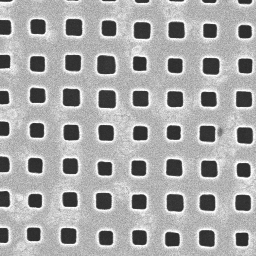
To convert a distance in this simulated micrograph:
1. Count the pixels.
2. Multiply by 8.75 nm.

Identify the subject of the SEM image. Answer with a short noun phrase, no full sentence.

a regular array of holes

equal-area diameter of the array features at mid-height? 147 nm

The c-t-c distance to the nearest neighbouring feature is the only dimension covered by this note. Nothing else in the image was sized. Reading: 293 nm